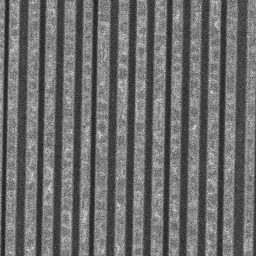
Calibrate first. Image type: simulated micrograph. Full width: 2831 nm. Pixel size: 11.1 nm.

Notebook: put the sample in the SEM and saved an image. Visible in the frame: parallel lines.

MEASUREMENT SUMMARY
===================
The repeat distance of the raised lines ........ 202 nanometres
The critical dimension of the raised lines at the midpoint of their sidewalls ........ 0.127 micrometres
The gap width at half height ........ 74.7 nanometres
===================